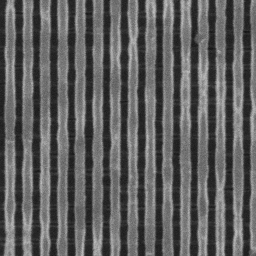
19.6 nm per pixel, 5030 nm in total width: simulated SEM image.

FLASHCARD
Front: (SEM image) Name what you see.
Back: wiring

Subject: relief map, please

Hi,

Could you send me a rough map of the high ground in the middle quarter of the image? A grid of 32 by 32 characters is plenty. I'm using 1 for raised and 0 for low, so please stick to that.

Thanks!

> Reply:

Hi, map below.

10011001100011001100011001100010
10011001100011001100011001100010
10011001100011001100011001100010
10011001100011001100011001100010
10011001100011001100011001100110
10011001100011001100011001100110
10011001100011001100011001100110
10011000100011001100011001100110
10011001100011001100011001100110
10011001100011001100011001100110
10011001100011001100011001100110
10011001100011001100011001100010
10011001100011001100011001100110
10011001100011001100011001100110
10011000100011001100011001100110
10011000100011001100011001100110
10011000100011001100011001100110
10011000100011001100011001100110
10011001100011001100011001100110
10011001100011001100011001100110
10011001100011001100011001100110
10011001100011001100011001100110
10011001100011001100011001100110
10011001100011001100011001100110
10011001100011001100011001100110
10011001100011001100011001100110
10011001100011001100011001100110
10011001100011001100011001100110
10011001100011001100011001100110
10011001100011001100111001100110
10011001100011001100111001100110
10011001100011001100011001100110